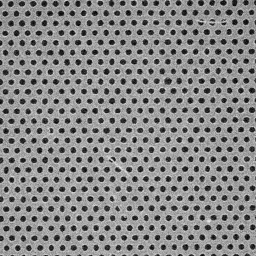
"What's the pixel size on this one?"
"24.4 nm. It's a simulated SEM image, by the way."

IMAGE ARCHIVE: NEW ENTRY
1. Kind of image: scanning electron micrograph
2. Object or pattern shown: a regular array of holes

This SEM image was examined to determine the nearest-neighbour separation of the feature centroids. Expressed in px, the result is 11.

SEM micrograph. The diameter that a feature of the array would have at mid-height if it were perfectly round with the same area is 158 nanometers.